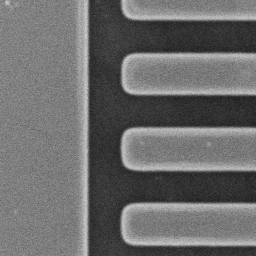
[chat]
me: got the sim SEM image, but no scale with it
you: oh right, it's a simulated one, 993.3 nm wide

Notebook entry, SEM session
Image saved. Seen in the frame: wiring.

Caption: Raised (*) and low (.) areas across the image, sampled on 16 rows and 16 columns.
*****...********
*****...........
*****...........
*****...********
*****...********
*****...********
*****...........
*****...........
*****...********
*****...********
*****...********
*****...........
*****...........
*****...********
*****...********
*****...........